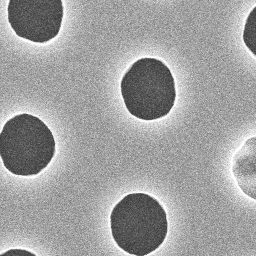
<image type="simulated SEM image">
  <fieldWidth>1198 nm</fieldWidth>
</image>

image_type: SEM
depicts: holes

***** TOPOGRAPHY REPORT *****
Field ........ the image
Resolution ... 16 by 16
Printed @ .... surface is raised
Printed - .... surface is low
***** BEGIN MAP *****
----@@@@@@@@@@@@
@---@@@@@@@@@@@-
@@-@@@@@@@@@@@@-
@@@@@@@@@@@@@@@@
@@@@@@@@---@@@@@
@@@@@@@@---@@@@@
@@@@@@@@---@@@@@
@--@@@@@@@@@@@@@
---@@@@@@@@@@@@@
---@@@@@@@@@@@@@
---@@@@@@@@@@@@@
@@@@@@@@@@@@@@@@
@@@@@@@@--@@@@@@
@@@@@@@---@@@@@@
@@@@@@@---@@@@@@
@@@@@@@@--@@@@@@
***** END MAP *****